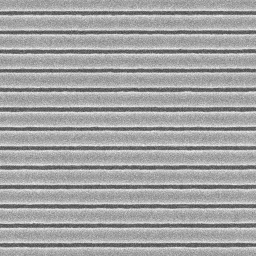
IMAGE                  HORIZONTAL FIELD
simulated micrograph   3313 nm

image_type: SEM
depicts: parallel lines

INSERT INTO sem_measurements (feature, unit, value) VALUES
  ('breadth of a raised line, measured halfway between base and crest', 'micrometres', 0.191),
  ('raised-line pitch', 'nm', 250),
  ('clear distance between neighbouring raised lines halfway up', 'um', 0.0598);